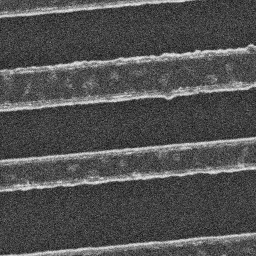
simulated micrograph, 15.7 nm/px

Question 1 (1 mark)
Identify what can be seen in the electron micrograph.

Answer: one or a few lines or trenches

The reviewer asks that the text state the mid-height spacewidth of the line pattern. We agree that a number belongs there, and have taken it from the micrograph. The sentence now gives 53.3 px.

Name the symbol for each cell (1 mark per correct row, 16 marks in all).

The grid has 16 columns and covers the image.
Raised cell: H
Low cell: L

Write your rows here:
HHHHHHLLLLLLLLLL
LLLLLLLLLLLLLLLL
LLLLLLLLLLLLLLLL
LLLLLLLLLLHHHHHH
HHHHHHHHHHHHHHHH
HHHHHHHHHHHHHHHL
HHHHLLLLLLLLLLLL
LLLLLLLLLLLLLLLL
LLLLLLLLLLLLLLLL
LLLLLLLHHHHHHHHH
HHHHHHHHHHHHHHHH
HHHHHLLLLLLLLLLL
LLLLLLLLLLLLLLLL
LLLLLLLLLLLLLLLL
LLLLLLLLLLLLLLLL
LLLLLLHHHHHHHHHH